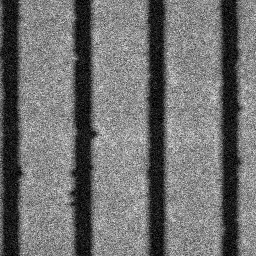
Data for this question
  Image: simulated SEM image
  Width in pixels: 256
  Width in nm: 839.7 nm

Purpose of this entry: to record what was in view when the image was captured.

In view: one or a few lines or trenches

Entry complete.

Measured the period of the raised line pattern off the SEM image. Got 73.2 px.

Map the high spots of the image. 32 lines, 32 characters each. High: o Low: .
...oooooo...oooooo...oooooo...oo
...oooooo...oooooo...oooooo...oo
...oooooo...oooooo...oooooo...oo
...oooooo...oooooo...oooooo...oo
...oooooo...oooooo...oooooo...oo
...oooooo...oooooo...oooooo...oo
...oooooo...oooooo...oooooo...oo
...oooooo...oooooo...oooooo...oo
...oooooo...oooooo...oooooo...oo
...oooooo...oooooo...oooooo...oo
...oooooo...oooooo...oooooo...oo
...oooooo...oooooo...oooooo...oo
...oooooo...oooooo...oooooo...oo
...oooooo...oooooo...oooooo...oo
...oooooo...oooooo...oooooo...oo
...oooooo...oooooo...oooooo...oo
...oooooo...oooooo...oooooo...oo
...oooooo...oooooo...oooooo...oo
...oooooo...oooooo...oooooo...oo
...oooooo...oooooo...oooooo...oo
...oooooo...oooooo...oooooo...oo
...oooooo...oooooo...oooooo...oo
...oooooo...oooooo...ooooooo..oo
...oooooo...oooooo...ooooooo..oo
...oooooo...oooooo...ooooooo..oo
...oooooo...oooooo...ooooooo..oo
...oooooo...oooooo...ooooooo..oo
...oooooo...oooooo...ooooooo..oo
...oooooo...oooooo...ooooooo..oo
...oooooo...oooooo...ooooooo..oo
...oooooo...oooooo...oooooo...oo
...oooooo...oooooo...oooooo...oo